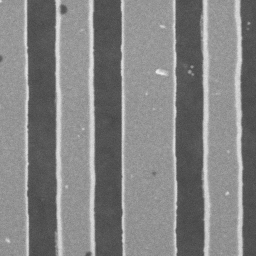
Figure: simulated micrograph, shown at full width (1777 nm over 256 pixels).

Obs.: lines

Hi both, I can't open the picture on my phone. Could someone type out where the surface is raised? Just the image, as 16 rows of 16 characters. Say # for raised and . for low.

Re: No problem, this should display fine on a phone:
##..##..###..##.
##..##..###..##.
##..##..###..##.
##..##..###..##.
##..##..###..##.
##..##..###..##.
##..##..###..##.
##..##..###..##.
##..##..###..##.
##..##..###..##.
##..##..###..##.
##..##..###..##.
##..##..###..##.
##..##..###..##.
##..##..###..##.
##..##..###..##.